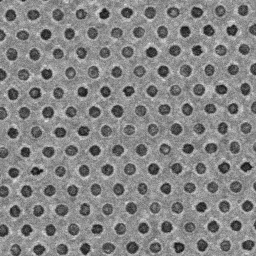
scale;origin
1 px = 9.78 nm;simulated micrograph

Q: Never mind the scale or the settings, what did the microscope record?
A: a regular array of holes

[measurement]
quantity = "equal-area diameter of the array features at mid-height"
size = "119 nm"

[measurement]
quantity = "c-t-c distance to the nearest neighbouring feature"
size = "217 nm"